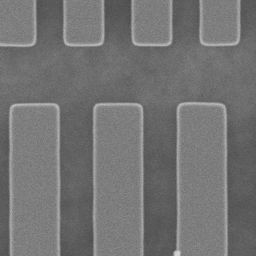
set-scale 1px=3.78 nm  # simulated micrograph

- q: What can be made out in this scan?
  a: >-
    groups of lines, slits or small figures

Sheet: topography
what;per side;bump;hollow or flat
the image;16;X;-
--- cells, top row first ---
XX--XX--XXX--XX-
XX--XX--XXX--XX-
XX--XX--XXX--XX-
----------------
----------------
----------------
------XX----XX--
-XXX--XXX--XXX--
-XXX--XXX--XXX--
-XXX--XXX--XXX--
-XXX--XXX--XXX--
-XXX--XXX--XXX--
-XXX--XXX--XXX--
-XXX--XXX--XXX--
-XXX--XXX--XXX--
-XXX--XXX--XXX--